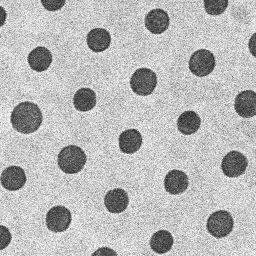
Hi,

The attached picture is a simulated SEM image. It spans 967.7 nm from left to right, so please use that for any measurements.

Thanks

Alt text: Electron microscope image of a regular array of holes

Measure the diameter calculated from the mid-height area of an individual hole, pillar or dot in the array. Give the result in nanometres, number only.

96.7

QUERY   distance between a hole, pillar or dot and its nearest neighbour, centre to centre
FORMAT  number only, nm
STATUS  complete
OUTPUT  230